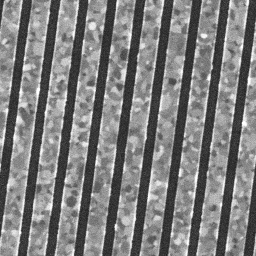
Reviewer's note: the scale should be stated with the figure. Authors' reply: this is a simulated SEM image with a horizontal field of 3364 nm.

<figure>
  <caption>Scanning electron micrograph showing parallel lines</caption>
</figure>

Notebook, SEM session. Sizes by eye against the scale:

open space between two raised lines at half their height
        129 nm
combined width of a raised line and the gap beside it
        368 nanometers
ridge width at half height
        238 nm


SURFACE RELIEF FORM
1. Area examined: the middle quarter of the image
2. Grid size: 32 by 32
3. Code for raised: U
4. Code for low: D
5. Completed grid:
UUDDUUUUUDDUUUUUDDUUUUUDDUUUUUDD
UDDDUUUUDDDUUUUDDDUUUUUDDUUUUUDD
UDDDUUUUDDDUUUUDDDUUUUDDDUUUUUDD
UDDDUUUUDDDUUUUDDDUUUUDDDUUUUDDD
UDDDUUUUDDDUUUUDDDUUUUDDDUUUUDDD
UDDDUUUUDDDUUUUDDDUUUUDDDUUUUDDD
UDDUUUUUDDUUUUUDDDUUUUDDDUUUUDDD
UDDUUUUUDDUUUUUDDDUUUUDDUUUUUDDD
UDDUUUUUDDUUUUUDDUUUUUDDUUUUUDDU
DDDUUUUDDDUUUUUDDUUUUUDDUUUUUDDU
DDDUUUUDDDUUUUDDDUUUUDDDUUUUDDDU
DDDUUUUDDDUUUUDDDUUUUDDDUUUUDDDU
DDUUUUUDDDUUUUDDDUUUUDDDUUUUDDDU
DDUUUUUDDUUUUUDDDUUUUDDDUUUUDDDU
DDUUUUUDDUUUUUDDUUUUUDDDUUUUDDDU
DDUUUUUDDUUUUUDDUUUUUDDUUUUUDDUU
DDUUUUDDDUUUUUDDUUUUUDDUUUUUDDUU
DDUUUUDDDUUUUDDDUUUUUDDUUUUUDDUU
DDUUUUDDDUUUUDDDUUUUUDDUUUUDDDUU
DUUUUUDDDUUUUDDDUUUUDDDUUUUDDDUU
DDUUUUDDDUUUUDDDUUUUDDDUUUUDDDUU
DUUUUUDDUUUUUDDUUUUUDDDUUUUDDDUU
DUUUUUDDUUUUUDDUUUUUDDUUUUUDDDUU
DUUUUUDDUUUUUDDUUUUUDDUUUUUDDUUU
DUUUUDDDUUUUUDDUUUUDDDUUUUUDDUUU
DUUUUDDDUUUUDDDUUUUDDDUUUUDDDUUU
DUUUUDDDUUUUDDDUUUUDDDUUUUDDDUUU
DUUUUDDDUUUUDDDUUUUDDDUUUUDDDUUU
UUUUUDDDUUUUDDDUUUUDDDUUUUDDDUUU
UUUUUDDUUUUUDDDUUUUDDDUUUUDDDUUU
UUUUUDDUUUUUDDUUUUUDDUUUUUDDUUUU
UUUUDDDUUUUUDDUUUUUDDUUUUUDDUUUU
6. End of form